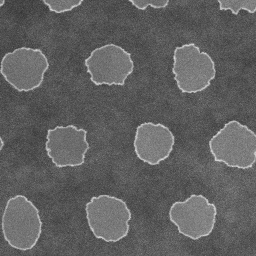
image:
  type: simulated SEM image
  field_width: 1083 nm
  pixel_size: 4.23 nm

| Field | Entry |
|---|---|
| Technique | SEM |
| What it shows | a regular array of raised bodies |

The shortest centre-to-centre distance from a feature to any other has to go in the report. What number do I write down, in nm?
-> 353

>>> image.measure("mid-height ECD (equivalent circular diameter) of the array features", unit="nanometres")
184